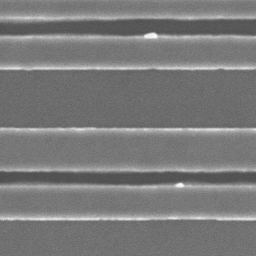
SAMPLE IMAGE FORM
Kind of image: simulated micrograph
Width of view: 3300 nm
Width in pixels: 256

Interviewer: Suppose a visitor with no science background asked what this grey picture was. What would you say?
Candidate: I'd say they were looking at lines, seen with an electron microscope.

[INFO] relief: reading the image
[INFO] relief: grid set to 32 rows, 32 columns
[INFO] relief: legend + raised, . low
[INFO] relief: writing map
++++++++++++++++++++++++++++++++
++++++++++++++++++++++++++++++++
................................
................................
..................++............
++++++++++++++++++++++++++++++++
++++++++++++++++++++++++++++++++
++++++++++++++++++++++++++++++++
+++++.++.......+.......++++.+++.
................................
................................
................................
................................
................................
................................
................................
++++++++++++++++++++++++++++++++
++++++++++++++++++++++++++++++++
++++++++++++++++++++++++++++++++
++++++++++++++++++++++++++++++++
++++++++++++++++++++++++++++++++
................................
................................
++++++++++++++++++++++++++++++++
++++++++++++++++++++++++++++++++
++++++++++++++++++++++++++++++++
++++++++++++++++++++++++++++++++
................................
................................
................................
................................
................................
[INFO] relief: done